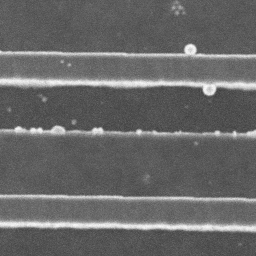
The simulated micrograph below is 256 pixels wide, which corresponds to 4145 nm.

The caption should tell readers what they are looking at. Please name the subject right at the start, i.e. lines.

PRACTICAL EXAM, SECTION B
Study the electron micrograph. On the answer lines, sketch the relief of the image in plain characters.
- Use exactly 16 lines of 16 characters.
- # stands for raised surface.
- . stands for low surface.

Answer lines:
################
################
################
################
################
.............#..
................
................
################
################
################
################
################
################
................
................